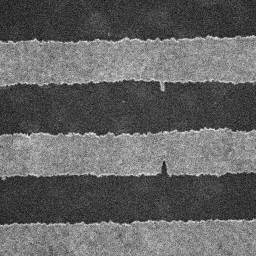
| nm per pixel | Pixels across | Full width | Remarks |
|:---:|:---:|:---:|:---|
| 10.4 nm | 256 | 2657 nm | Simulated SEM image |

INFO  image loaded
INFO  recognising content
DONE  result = one or a few lines or trenches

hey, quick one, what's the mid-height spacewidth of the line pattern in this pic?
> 511 nm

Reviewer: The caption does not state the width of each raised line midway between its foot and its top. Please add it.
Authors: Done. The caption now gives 435 nm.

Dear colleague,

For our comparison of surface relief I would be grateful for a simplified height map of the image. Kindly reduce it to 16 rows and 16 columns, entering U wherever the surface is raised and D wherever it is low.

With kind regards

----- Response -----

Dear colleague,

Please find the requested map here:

DDDDDDDDDDDDDDDD
DDDDDDDDDDDDDDDD
DDDDDDDDUDUUUUUU
UUUUUUUUUUUUUUUU
UUUUUUUUUUUUUUUU
DDDDDDDDDDDDDDDD
DDDDDDDDDDDDDDDD
DDDDDDDDDDDDDDDD
UUUUUUUUUUUUUUUU
UUUUUUUUUUUUUUUU
UUUUUUUUUUUUUUUU
DDDDDDDDDDDDDDDD
DDDDDDDDDDDDDDDD
DDDDDDDDDDDDDDDD
UUUUUUUUUUUUUUUU
UUUUUUUUUUUUUUUU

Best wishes